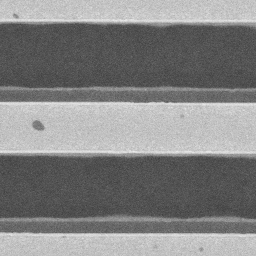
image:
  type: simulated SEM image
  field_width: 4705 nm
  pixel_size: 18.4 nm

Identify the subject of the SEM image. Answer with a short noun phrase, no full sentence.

lines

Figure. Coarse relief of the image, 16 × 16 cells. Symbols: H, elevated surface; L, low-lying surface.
HHHHHHHHHHHHHHHH
LLLLLLLLLLLLLLLL
LLLLLLLLLLLLLLLL
LLLLLLLLLLLLLLLL
LLLLLLLLLLLLLLLL
LLLLLLLLLLLLLLLL
HHHHHHHHHHHHHHHH
HHHHHHHHHHHHHHHH
HHHHHHHHHHHHHHHH
HHHHHHHHHHHHHHHH
LLLLLLLLLLLLLLLL
LLLLLLLLLLLLLLLL
LLLLLLLLLLLLLLLL
LLLLLLLLLLLLLLLL
LLLLLLLLLLLLLLLL
HHHHHHHHHHHHHHHH